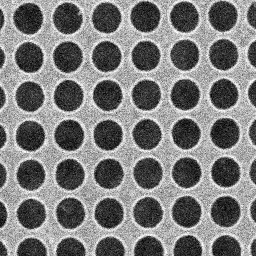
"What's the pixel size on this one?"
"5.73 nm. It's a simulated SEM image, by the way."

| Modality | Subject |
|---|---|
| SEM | a regular array of holes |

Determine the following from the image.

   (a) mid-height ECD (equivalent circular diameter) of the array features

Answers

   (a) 182 nm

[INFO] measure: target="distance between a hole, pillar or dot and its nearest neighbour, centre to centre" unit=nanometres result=222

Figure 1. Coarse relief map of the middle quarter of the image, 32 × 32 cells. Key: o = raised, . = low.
....oooo......ooo......oooo.....
...ooooo.....oooooo...ooooooo...
.ooooooooooooooooooooooooooooooo
ooooooooooooooooooooooooooooo..o
...oooooo....oooooo....ooooo....
....oooo......ooo.......ooo.....
.....oo........oo.......ooo.....
.....oo........oo.......oo......
.....oo........oo.......oo......
.....oo........oo.......ooo.....
....oooo......oooo......ooo.....
...oooooo....oooooo...ooooooo...
oooooooooooooooooooooooooooooooo
oooooooooooooooooooo.ooooooooo.o
....ooooo....ooooo.....ooooo....
....oooo......oooo......ooo.....
.....oo........oo.......ooo.....
.....oo........oo........oo.....
.....oo........oo........oo.....
.....ooo.......oo.......ooo.....
....oooo......oooo.....ooooo....
...ooooooo..oooooooo..oooooooo.o
oooooooooooooooooooooooooooooooo
o.oooooooo..oooooooo..ooooooo...
....ooooo.....oooo......oooo....
.....ooo.......oo.......ooo.....
.....oo........oo........oo.....
.....oo........oo........oo.....
.....oo........oo........oo.....
.....ooo.......ooo......oooo....
....ooooo.....oooo.....oooooo...
...oooooooo.ooooooooo.oooooooooo